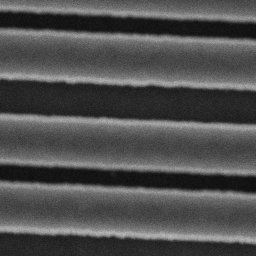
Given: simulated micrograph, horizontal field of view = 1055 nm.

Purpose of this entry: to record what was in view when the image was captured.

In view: lines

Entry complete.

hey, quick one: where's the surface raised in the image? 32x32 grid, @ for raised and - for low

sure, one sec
@@@@@@@@@@@@@@@@@@@@@@@@@@@@@@@@
----@@@@@@@@@@@@@@@@@@@@@@@@@@@@
----------------------------@@@@
--------------------------------
@@@@@@@@@@@@@@@@@@@@@-----------
@@@@@@@@@@@@@@@@@@@@@@@@@@@@@@@@
@@@@@@@@@@@@@@@@@@@@@@@@@@@@@@@@
@@@@@@@@@@@@@@@@@@@@@@@@@@@@@@@@
@@@@@@@@@@@@@@@@@@@@@@@@@@@@@@@@
@@@@@@@@@@@@@@@@@@@@@@@@@@@@@@@@
---------------@@@@@@@@@@@@@@@@@
--------------------------------
--------------------------------
--------------------------------
@@@@@---------------------------
@@@@@@@@@@@@@@@@@@@@@@@@@@------
@@@@@@@@@@@@@@@@@@@@@@@@@@@@@@@@
@@@@@@@@@@@@@@@@@@@@@@@@@@@@@@@@
@@@@@@@@@@@@@@@@@@@@@@@@@@@@@@@@
@@@@@@@@@@@@@@@@@@@@@@@@@@@@@@@@
@@@@@@@@@@@@@@@@@@@@@@@@@@@@@@@@
-----------------------@@@@@@@@@
--------------------------------
@@@@@@@@@@@@@@@@@@--------------
@@@@@@@@@@@@@@@@@@@@@@@@@@@@@@@@
@@@@@@@@@@@@@@@@@@@@@@@@@@@@@@@@
@@@@@@@@@@@@@@@@@@@@@@@@@@@@@@@@
@@@@@@@@@@@@@@@@@@@@@@@@@@@@@@@@
@@@@@@@@@@@@@@@@@@@@@@@@@@@@@@@@
------------@--@@@@@@@@@@@@@@@@@
--------------------------------
--------------------------------